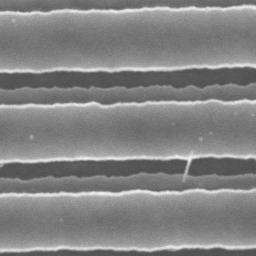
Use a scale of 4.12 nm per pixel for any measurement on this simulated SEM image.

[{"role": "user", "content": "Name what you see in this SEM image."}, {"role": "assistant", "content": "lines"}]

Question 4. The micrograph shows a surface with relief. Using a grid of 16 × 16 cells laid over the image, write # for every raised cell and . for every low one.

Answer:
.........##.####
################
################
################
###.............
................
....##.#########
################
################
################
................
................
################
################
################
############..##